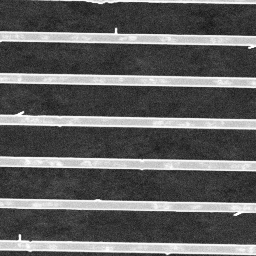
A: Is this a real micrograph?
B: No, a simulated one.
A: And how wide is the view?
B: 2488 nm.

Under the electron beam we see parallel lines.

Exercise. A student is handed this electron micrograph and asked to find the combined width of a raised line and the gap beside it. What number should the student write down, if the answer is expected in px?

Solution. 41.7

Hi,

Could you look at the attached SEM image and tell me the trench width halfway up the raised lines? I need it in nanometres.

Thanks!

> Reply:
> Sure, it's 311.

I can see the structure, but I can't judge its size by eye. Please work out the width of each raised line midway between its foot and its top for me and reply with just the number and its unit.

88.7 nm